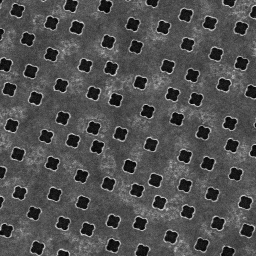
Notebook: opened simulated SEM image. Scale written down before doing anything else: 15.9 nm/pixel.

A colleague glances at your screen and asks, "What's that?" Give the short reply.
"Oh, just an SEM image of a regular array of holes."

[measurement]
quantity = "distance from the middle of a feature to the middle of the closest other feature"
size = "0.422 um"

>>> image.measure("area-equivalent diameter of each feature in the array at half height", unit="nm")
208